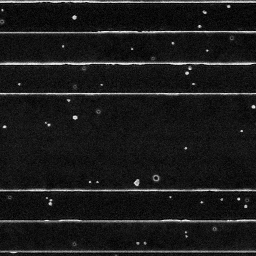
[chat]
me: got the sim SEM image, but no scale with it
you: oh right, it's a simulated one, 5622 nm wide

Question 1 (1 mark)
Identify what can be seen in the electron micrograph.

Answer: lines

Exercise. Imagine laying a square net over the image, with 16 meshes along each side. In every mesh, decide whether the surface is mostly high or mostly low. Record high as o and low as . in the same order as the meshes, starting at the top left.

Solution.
................
................
oooooooooooooooo
oooooooooooooooo
................
................
oooooooooooooooo
oooooooooooooooo
oooooooooooooooo
oooooooooooooooo
oooooooooooooooo
oooooooooooooooo
................
................
oooooooooooooooo
oooooooooooooooo